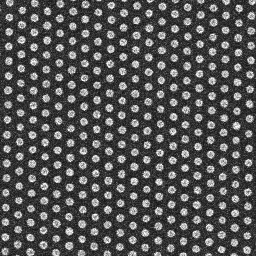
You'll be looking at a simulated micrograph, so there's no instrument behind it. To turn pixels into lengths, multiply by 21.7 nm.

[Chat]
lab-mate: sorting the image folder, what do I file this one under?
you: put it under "a regular array of raised bodies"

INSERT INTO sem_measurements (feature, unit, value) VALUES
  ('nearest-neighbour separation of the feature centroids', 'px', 14.3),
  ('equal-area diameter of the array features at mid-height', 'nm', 153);